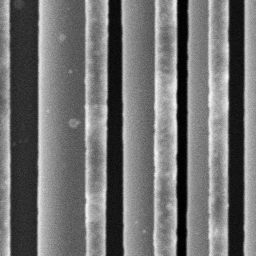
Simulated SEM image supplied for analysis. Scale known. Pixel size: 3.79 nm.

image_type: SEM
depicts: lines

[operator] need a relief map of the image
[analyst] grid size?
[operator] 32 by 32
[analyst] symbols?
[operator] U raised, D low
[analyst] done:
UDDDDUUUUUUUUDDUUUUUUUDDUUUUUDDU
UDDDDUUUUUUUUDDUUUUUUUDDUUUUUDDU
UDDDDUUUUUUUUDDUUUUUUUDDUUUUUDDU
UDDDDUUUUUUUUDDUUUUUUUDDUUUUUDDU
UDDDDUUUUUUUUDDUUUUUUUDDUUUUDDDU
UDDDDUUUUUUUUDDUUUUUUUDDUUUUUDDU
UDDDDUUUUUUUUDDUUUUUUUDDUUUUUDDU
UDDDDUUUUUUUUDDUUUUUUUDDUUUUUDDU
UDDDDUUUUUUUUDDUUUUUUUDDUUUUUDDU
UDDDDUUUUUUUUDDUUUUUUUDDUUUUUDDU
UDDDDUUUUUUUUDDUUUUUUUDDUUUUDDDU
UDDDDUUUUUUUUDDUUUUUUUDDUUUUDDDU
UDDDDUUUUUUUUDDUUUUUUUDDUUUUUDDU
UDDDDUUUUUUUUDDUUUUUUUDDUUUUUDDU
UDDDDUUUUUUUUDDUUUUUUUDDUUUUDDDU
UDDDDUUUUUUUUDDUUUUUUUDDUUUUDDDU
UDDDDUUUUUUUUDDUUUUUUUDDUUUUDDDU
UDDDDUUUUUUUUDDUUUUUUUDDUUUUDDDU
UDDDDUUUUUUUUDDUUUUUUUDDUUUUUDDU
UDDDDUUUUUUUUDDUUUUUUUDDUUUUDDDU
UDDDDUUUUUUUUDDUUUUUUUDDUUUUDDDU
UDDDDUUUUUUUUDDUUUUUUUDDUUUUDDDU
UDDDDUUUUUUUUDDUUUUUUUDDUUUUDDDU
UDDDDUUUUUUUUDDUUUUUUUDDUUUUDDDU
UDDDDUUUUUUUUDDUUUUUUUDDUUUUDDDU
UDDDDUUUUUUUUDDUUUUUUUDDUUUUUDDU
UDDDDUUUUUUUUDDUUUUUUUDUUUUUDDDU
UDDDDUUUUUUUUDDUUUUUUUDUUUUUDDDU
UDDDDUUUUUUUUDDUUUUUUUDUUUUUDDDU
UDDDDUUUUUUUUDDUUUUUUUDUUUUUDDDU
UDDDDUUUUUUUUDDUUUUUUUDUUUUUDDDU
UDDDDUUUUUUUUDDDUUUUUUDUUUUUDDDU